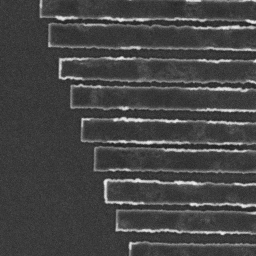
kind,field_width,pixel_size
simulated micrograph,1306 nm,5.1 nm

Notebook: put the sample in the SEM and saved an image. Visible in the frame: parallel lines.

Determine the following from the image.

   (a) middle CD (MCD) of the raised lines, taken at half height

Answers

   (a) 119 nm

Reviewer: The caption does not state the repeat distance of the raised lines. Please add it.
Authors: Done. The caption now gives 157 nm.